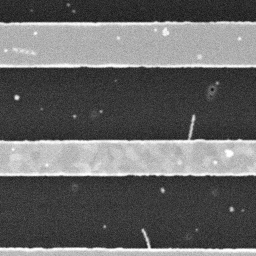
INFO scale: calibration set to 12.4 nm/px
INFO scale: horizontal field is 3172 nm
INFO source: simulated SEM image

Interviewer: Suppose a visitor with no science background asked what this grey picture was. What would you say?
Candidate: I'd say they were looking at lines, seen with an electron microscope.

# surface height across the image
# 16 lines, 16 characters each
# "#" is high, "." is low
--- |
................
################
################
################
................
................
................
................
................
################
################
................
................
................
................
................